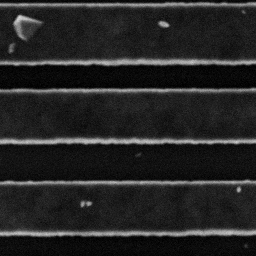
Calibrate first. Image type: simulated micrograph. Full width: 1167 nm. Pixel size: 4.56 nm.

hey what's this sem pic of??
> lines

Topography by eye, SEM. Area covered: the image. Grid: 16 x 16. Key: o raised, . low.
oooooooooooooooo
oooooooooooooooo
oooooooooooooooo
oooooooooooooooo
................
................
oooooooooooooooo
oooooooooooooooo
oooooooooooooooo
................
................
oooooooooooooooo
oooooooooooooooo
oooooooooooooooo
oooooooooooooooo
................